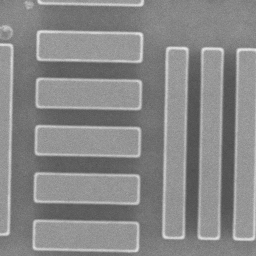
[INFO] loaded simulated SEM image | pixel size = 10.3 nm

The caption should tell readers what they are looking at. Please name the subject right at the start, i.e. groups of lines, slits or small figures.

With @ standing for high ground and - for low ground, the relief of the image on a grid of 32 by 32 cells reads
-------@@@@@@@@@@@--------------
--------------------------------
--------------------------------
--------------------------------
-----@@@@@@@@@@@@@--------------
-----@@@@@@@@@@@@@--------------
@@---@@@@@@@@@@@@@---@@--@@@--@@
@@---@@@@@@@@@@@@----@@--@@@--@@
@@-------------------@@--@@@--@@
@--------------------@@--@@@--@@
@----@@@@@@@@@@@@@---@@--@@@--@@
@----@@@@@@@@@@@@@---@@--@@@--@@
@----@@@@@@@@@@@@@---@@--@@@--@@
@--------@@@@@@@@----@@--@@@--@@
@--------------------@@--@@@-@@@
@--------------------@@--@@@-@@@
@---@@@@@@@@@@@@@----@@--@@@-@@@
@---@@@@@@@@@@@@@----@@--@@@-@@@
@---@@@@@@@@@@@@@----@@--@@@-@@@
@---------------@----@@--@@@-@@@
@--------------------@@--@@@-@@@
@--------------------@@--@@@-@@@
@---@@@@@@@@@@@@@----@@--@@--@@@
@---@@@@@@@@@@@@@----@@--@@--@@@
@---@@@@@@@@@@@@@----@@--@@--@@@
@--------------------@@--@@--@@@
@--------------------@@--@@--@@@
@-------------------@@@--@@--@@@
@---@@@@@@@@@@@@@---@@@--@@--@@@
----@@@@@@@@@@@@@----@@--@@--@@@
----@@@@@@@@@@@@@---------------
--------------------------------